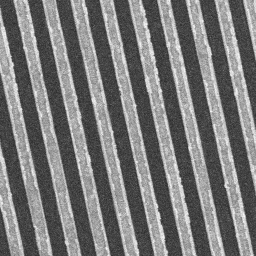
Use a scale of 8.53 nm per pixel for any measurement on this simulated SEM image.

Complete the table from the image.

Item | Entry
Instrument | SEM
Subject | parallel lines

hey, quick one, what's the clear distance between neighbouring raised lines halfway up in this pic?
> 132 nm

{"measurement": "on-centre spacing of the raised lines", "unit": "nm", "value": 239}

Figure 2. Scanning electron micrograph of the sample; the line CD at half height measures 12.6 px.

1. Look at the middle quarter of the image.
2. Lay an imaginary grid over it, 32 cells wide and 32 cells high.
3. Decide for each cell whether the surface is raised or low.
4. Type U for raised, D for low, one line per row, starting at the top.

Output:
UDDDDUUUUDDDDUUUDDDDUUUDDDDUUUDD
UUDDDDUUUDDDDUUUDDDDUUUDDDDUUUDD
UUDDDDUUUDDDDUUUDDDDUUUDDDDUUUUD
UUDDDDUUUDDDDUUUDDDDUUUUDDDDUUUD
UUDDDDUUUDDDDUUUUDDDUUUUDDDDUUUD
UUDDDDUUUUDDDDUUUDDDDUUUDDDDUUUD
UUUDDDDUUUDDDDUUUDDDDUUUDDDDUUUD
UUUDDDDUUUDDDDUUUDDDDUUUDDDDUUUU
UUUDDDDUUUDDDDUUUDDDDUUUUDDDDUUU
UUUDDDDUUUDDDDDUUUDDDDUUUDDDDUUU
UUUDDDDDUUUDDDDUUUDDDDUUUDDDDUUU
DUUUDDDDUUUDDDDUUUDDDDUUUDDDDUUU
DUUUDDDDUUUDDDDUUUDDDDUUUDDDDDUU
DUUUDDDDUUUDDDDUUUDDDDDUUUDDDDUU
DUUUDDDDUUUUDDDDUUUDDDDUUUDDDDUU
DUUUUDDDDUUUDDDDUUUDDDDUUUDDDDUU
DDUUUDDDDUUUDDDDUUUDDDDUUUDDDDUU
DDUUUDDDDUUUDDDDUUUDDDDUUUUDDDDU
DDUUUDDDDUUUDDDDUUUUDDDDUUUDDDDU
DDUUUDDDDUUUUDDDDUUUDDDDUUUDDDDU
DDUUUUDDDDUUUDDDDUUUDDDDUUUDDDDU
DDDUUUDDDDUUUDDDDUUUDDDDUUUDDDDU
DDDUUUDDDDUUUDDDDUUUDDDDUUUUDDDD
DDDUUUUDDDUUUDDDDDUUUDDDDUUUDDDD
DDDUUUUDDDDUUUDDDDUUUDDDDUUUDDDD
DDDDUUUDDDDUUUDDDDUUUDDDDUUUDDDD
DDDDUUUDDDDUUUDDDDUUUDDDDUUUUDDD
DDDDUUUDDDDUUUDDDDUUUDDDDDUUUDDD
DDDDUUUDDDDUUUUDDDDUUUDDDDUUUDDD
DDDDUUUUDDDDUUUDDDDUUUDDDDUUUDDD
UDDDDUUUDDDDUUUDDDDUUUDDDDUUUUDD
UDDDDUUUDDDDUUUDDDDUUUDDDDUUUUDD